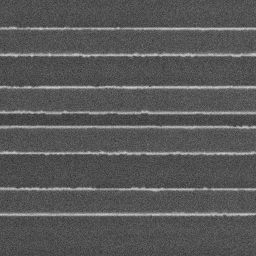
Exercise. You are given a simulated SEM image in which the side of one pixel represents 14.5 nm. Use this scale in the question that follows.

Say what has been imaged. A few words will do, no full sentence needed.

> lines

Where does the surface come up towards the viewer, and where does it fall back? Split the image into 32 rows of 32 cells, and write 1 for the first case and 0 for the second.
00000000000000000000000000000000
00000000000000000000000000000000
00000000000000000000000000000000
01000000000000000000000000000000
11111111111111111111111111111111
11111111111111111111111111111111
11111111111111111111111111111111
00000000000000000000000000000000
00000000000000000000000000000000
00000000000000000000000000000000
00000000000000000000000000000000
11111111111111111111111111111111
11111111111111111111111111111111
11111111111111111111111111111111
00000000000000000000000000000000
00000000000000000000000000000000
11111111111111111111111111111111
11111111111111111111111111111111
11111111111111111111111111111111
00000000000000000000000000000000
00000000000000000000000000000000
00000000000000000000000000000000
00000000000000000000000000000000
00000000000000000000000000000000
11111111111111111111111111111111
11111111111111111111111111111111
11111111111111111111111111111111
00000000000000000000000000000000
00000000000000000000000000000000
00000000000000000000000000000000
00000000000000000000000000000000
00000000000000000000000000000000